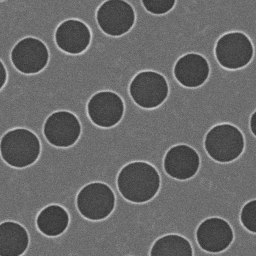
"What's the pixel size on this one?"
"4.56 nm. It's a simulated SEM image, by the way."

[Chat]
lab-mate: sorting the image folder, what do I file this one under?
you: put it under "a regular array of holes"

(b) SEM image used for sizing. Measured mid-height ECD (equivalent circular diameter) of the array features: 165 nm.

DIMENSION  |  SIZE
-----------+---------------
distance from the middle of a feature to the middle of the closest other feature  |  215 nm